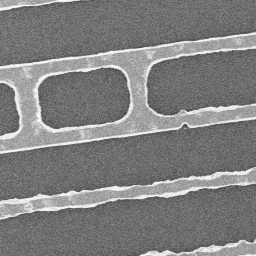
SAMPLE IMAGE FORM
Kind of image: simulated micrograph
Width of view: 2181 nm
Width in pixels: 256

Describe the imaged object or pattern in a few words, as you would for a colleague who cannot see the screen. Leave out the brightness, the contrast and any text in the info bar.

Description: one or a few lines or trenches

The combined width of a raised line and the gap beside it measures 67 pixels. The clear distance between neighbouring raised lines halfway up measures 466 nm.